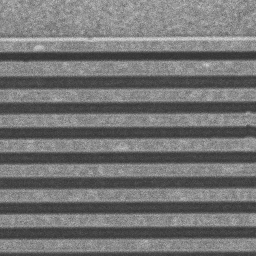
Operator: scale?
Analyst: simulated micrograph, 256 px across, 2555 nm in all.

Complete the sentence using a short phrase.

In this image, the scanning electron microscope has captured parallel lines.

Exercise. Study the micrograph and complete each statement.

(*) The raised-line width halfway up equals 140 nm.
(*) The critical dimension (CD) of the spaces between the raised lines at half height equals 112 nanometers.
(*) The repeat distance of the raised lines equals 0.249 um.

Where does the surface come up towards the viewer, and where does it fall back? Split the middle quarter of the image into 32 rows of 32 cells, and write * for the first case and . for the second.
********************************
********************************
********************************
................................
................................
................................
********************************
********************************
********************************
................................
................................
................................
...........*********************
********************************
********************************
********************************
................................
................................
................................
********************************
********************************
********************************
................................
................................
................................
********************************
********************************
********************************
................................
................................
................................
********************************